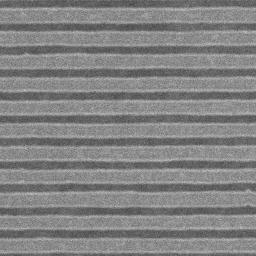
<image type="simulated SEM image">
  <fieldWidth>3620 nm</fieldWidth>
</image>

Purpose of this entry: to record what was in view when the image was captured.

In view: parallel lines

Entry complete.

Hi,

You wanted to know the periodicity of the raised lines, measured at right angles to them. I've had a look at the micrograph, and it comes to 325 nm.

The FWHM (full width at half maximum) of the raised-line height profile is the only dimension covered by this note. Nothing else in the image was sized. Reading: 0.186 um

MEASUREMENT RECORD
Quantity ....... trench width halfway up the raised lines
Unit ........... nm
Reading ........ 136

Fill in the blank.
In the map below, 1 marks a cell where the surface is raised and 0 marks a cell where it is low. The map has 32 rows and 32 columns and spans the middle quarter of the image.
11111111111111111111111111111111
00000000000000000000000000000000
00000000000000000000000000000000
00000000000000000000000000000000
11111111111111111111111111111111
11111111111111111111111111111111
11111111111111111111111111111111
00000000000000000000000000000000
00000000000000000000000000000000
11111111111111111111111111111111
11111111111111111111111111111111
11111111111111111111111111111111
11100000111111000111100000000000
00000000000000000000000000000000
00000000000000000000000000000000
11111111111111111111111111111111
11111111111111111111111111111111
11111111111111111111111111111111
00000000000000000000000000000000
00000000000000000000000000000000
00000000000000000000000000000000
11111111111111111111111111111111
11111111111111111111111111111111
11111111111111111111111111111111
00000000000000000000000000000000
00000000000000000000000000000000
00000000000000000000000000000000
11111111111111111111111111111111
11111111111111111111111111111111
10011111111111111111111111111111
00000000000000000000000000000000
00000000000000000000000000000000